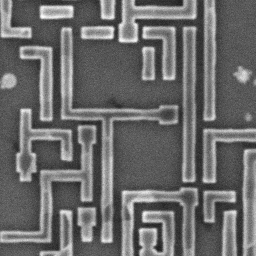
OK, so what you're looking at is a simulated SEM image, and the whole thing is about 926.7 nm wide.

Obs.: wiring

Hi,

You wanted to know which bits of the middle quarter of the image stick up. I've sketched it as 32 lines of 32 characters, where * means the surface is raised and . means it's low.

**..................**...***..**
**..................**...***..**
**..................**...***..**
**..................**...***..**
**............................**
**............................**
**............................**
**............................**
**............................**
**............................**
**............................**
******************....******..**
****************************..**
****************************..**
..........**............****..**
..........**..................**
....****..**..................**
**..****..**..................**
**..****..**..................**
**..****..**..................**
**...**...**..................**
**...**...**..................**
**...**...**..................**
**...**...**..................**
.....**...**..................**
.....**...**..................**
....***...**..................**
*******...**..................**
*******...**..................**
....***...**....................
.....**...**....................
.....**...**.................***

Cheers